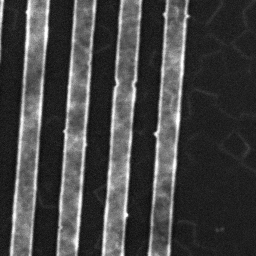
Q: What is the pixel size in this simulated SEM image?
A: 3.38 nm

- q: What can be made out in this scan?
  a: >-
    parallel lines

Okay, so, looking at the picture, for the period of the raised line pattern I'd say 155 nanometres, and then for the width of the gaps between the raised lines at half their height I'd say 0.0897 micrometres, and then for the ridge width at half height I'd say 65.3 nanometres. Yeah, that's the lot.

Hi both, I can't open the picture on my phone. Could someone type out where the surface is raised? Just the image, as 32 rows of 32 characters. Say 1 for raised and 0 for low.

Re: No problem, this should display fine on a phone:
00001100011100011100011000000000
00001100011100011000011000000000
00001100011100011000011000000000
00011100011100011000011000000000
00011100011100011000011000000000
00011100011000011000011000000000
00011100011000011000011000000000
00011100011000011000111000000000
00011000011000011000111000000000
00011000011000011000111000000000
00011000011000011000111000000000
00011000011000111000111000000000
00011000011000111000110000000000
00011000111000111000110000000000
00011000111000110000110000000000
00011000111000110000110000000000
00011000111000110000110000000000
00011000111000110000110000000000
00111000111000110000110000000000
00111000110000110000110000000000
00110000110000110000110000000000
00110000110000110000110000000000
00110000110000110001110000000000
00110000110000110001110000000000
00110000110001110001100000000000
00110000110001110001100000000000
00110000110001110001100000000000
00110001110001110001100000000000
00110001110001110001100000000000
00110001110001100001100000000000
00110001110001100001100000000000
01110001110001100001100000000000